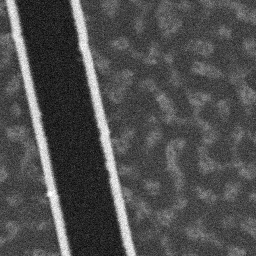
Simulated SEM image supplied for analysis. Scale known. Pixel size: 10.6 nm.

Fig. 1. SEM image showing one or a few lines or trenches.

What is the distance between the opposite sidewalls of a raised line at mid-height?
682 nm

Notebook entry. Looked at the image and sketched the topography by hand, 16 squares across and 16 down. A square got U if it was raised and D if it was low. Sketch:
DUUUUDDDDDDDDDDD
DUUUUDDDDDDDDDDD
DUUUUDDDDDDDDDDD
DUUUUDDDDDDDDDDD
DDUUUUDDDDDDDDDD
DDUUUUDDDDDDDDDD
DDUUUUDDDDDDDDDD
DDUUUUDDDDDDDDDD
DDUUUUUDDDDDDDDD
DDDUUUUDDDDDDDDD
DDDUUUUDDDDDDDDD
DDDUUUUDDDDDDDDD
DDDUUUUDDDDDDDDD
DDDDUUUUDDDDDDDD
DDDDUUUUDDDDDDDD
DDDDUUUUDDDDDDDD